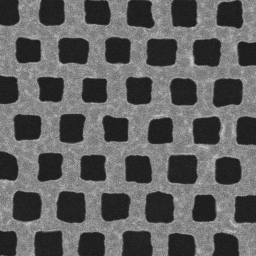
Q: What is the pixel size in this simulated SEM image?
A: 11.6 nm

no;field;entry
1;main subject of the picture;a regular array of holes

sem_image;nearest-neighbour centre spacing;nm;509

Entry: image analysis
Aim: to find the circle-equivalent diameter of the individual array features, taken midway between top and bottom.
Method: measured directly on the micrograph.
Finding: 339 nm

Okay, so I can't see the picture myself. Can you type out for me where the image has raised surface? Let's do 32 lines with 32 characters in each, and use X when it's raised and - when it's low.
--XXX---XX----XX---XXX---XX---XX
--XXX---XXX---XX---XX----XX---XX
--XXX---XXX---XX---XX----XX---XX
XXXXXXXXXXXXXXXXXX-XXXXXXXXXXXXX
XXXXXXXXXXXXXXXXXXXXXXXXXXXXXXXX
XX---XX----XX---XX----XX----XX--
XX---XX----XX---XX----XX----XX--
XX---XX----XX---XX----XX---XXX--
XXXXXXXXXXXXXXXXXXXXXXXXXXXXXXXX
-XXXXXXXXXXXXXXXXXXXXXXXXXXXXXXX
--XXX---XX---XXX---XX---XXX---XX
--XXX---XX---XXX---XX----XX---XX
--XXX---XX---XXX---XX----XX---XX
XXXXXXXXXXXXXXXXXXXXXXXXXXXXXXXX
XX---XXX--XXX-XXXXXXXXXXXXXXXXXX
XX---XX----XX---XXX---XX----XX--
XX---XX---XXX---XXX---XX---XXX--
XX--XXXX--XXX---XXX---XX---XXX--
XXXXXXXXXXXXXXXXXXXXXXXXXXXXXXXX
--XXX---XX---XXX--XXXX--XXXXXXXX
--XXX---XX---XXX---XX----XX---XX
--XXX---XX---XXX---XX----XX---XX
--XXX--XXXX--XXX---XX----XX---XX
XXXXXXXXXXXXXXXXXXXXXXXXXXXXXXXX
XX---XX----XX---XX---XXXX-XXXX--
XX---XX----XX---XX----XX---XX---
X----XX----XX---XX----XX---XX---
XX---XXX---XX--XXX----XX---XX---
XXXXXXXXXXXXXXXXXXXXXXXXXXXXXXXX
--XX----XX---XX----XX---XXX--XXX
--XX----XX---XX----XX---XXX---XX
--XX----XX---XX----XX---XXX---XX